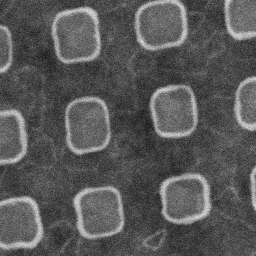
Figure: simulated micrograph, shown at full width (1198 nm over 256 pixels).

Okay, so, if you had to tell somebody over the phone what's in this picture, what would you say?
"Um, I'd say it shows raised bodies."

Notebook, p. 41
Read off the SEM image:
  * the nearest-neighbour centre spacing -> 410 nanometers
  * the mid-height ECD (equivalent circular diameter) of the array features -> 232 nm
